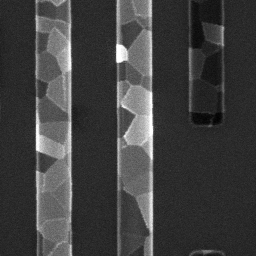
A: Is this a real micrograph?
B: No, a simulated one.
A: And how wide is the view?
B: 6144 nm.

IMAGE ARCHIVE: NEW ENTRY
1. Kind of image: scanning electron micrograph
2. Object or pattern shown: wiring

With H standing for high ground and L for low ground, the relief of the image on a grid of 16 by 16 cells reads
LLHHLLLHHLLLHHLL
LLHHLLLHHLLLHHLL
LLHHLLLHHLLLHHLL
LLHHLLLHHLLLHHLL
LLHHLLLHHLLLHHLL
LLHHLLLHHLLLHHLL
LLHHLLLHHLLLHHLL
LLHHLLLHHLLLHHLL
LLHHLLLHHHLLLLLL
LLHHLLLHHHLLLLLL
LLHHLLLHHHLLLLLL
LLHHLLLHHHLLLLLL
LLHHLLLHHHLLLLLL
LLHHLLLHHHLLLLLL
LLHHLLLHHHLLLLLL
LLHHLLLHHHLLLLLL